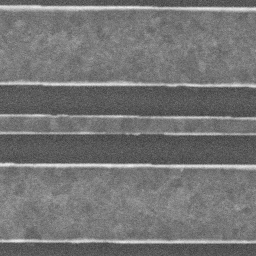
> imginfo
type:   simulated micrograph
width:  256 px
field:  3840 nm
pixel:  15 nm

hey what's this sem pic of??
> lines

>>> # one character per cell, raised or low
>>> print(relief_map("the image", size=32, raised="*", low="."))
................................
********************************
********************************
********************************
********************************
********************************
********************************
********************************
********************************
********************************
................****************
................................
................................
................................
****............................
********************************
********************************
................................
................................
................................
................................
********************************
********************************
********************************
********************************
********************************
********************************
********************************
********************************
********************************
................................
................................